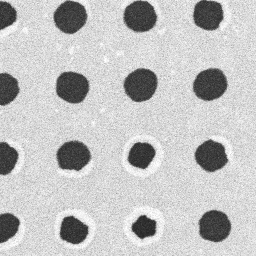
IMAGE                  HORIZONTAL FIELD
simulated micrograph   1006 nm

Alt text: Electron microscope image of a regular array of holes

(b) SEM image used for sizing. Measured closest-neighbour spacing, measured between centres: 0.274 µm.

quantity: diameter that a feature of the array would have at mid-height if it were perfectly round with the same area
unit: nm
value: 125